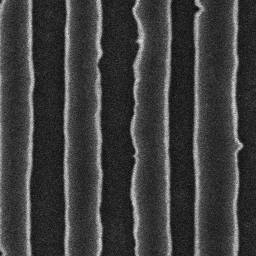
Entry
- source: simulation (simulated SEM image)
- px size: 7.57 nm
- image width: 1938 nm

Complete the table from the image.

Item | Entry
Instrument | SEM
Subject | one or a few lines or trenches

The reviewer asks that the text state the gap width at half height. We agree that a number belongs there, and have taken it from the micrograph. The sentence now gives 256 nanometers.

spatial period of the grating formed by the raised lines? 505 nanometers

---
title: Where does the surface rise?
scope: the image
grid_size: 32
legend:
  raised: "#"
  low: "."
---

####....####.....####....#####..
####....#####....####....#####..
####....#####....####...######..
####....#####....####...######..
####....####......###...######..
####....####......###...#####...
####....#####....####....#####..
####....####.....####....#####..
####....####.....####....#####..
####....####.....####....####...
####....####.....####....####...
####....####.....####....####...
####....####.....####....####...
####....####.....####....####...
####....####.....####....####...
####....####.....####....####...
####....####....#####...#####...
####....#####....####...######..
####....####.....####...######..
####....####.....####...######..
####....####.....####...######..
####....#####....####....#####..
####....#####....####....#####..
###.....#####....####....#####..
####....#####....####....#####..
####....####.....####...#####...
####....####.....####...#####...
####....#####....####...#####...
####....#####....####....#####..
####....#####....####....#####..
####....#####....####...######..
####....#####....####...######..